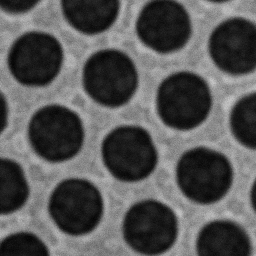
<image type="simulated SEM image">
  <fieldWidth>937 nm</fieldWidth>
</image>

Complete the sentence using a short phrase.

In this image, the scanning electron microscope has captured holes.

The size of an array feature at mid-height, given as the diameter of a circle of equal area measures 207 nanometers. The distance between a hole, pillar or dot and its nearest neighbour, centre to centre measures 279 nanometres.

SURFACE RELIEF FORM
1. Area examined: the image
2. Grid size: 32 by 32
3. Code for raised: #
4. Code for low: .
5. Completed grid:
.....###.......###.....#########
#..#####.......###.....#########
########......###.......####...#
#########.....###.......###.....
###....##########.......##......
##......##########.....###......
#.......####...#####.#####......
#.......###.....###########.....
#.......##.......##########.....
##.....###.......####....#######
###...####.......###......######
###########......###......######
.###########....####.......###..
.####...############......###...
.###......##########......###...
.###......###########....####...
####......####....###########...
####......###......###########..
####......###......#####..#####.
#####....####.......###.....####
..###########.......##.......###
...###########.....###.......###
...#####...####...####.......###
....###.....###########......##.
....##.......##########.....###.
...###.......####....####.#####.
..####.......###......##########
#######......##.......##########
#######.....###.......###.....##
#....####.#####.......###......#
......##########......###......#
......###########....####......#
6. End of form